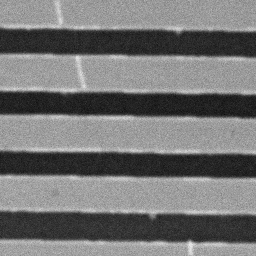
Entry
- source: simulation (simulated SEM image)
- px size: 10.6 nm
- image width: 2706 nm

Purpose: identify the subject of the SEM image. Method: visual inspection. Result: lines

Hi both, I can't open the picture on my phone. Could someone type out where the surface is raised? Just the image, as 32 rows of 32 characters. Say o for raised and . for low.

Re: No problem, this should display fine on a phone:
oooooooooooooooooooooooooooooooo
oooooooooooooooooooooooooooooooo
oooooooooooooooooooooooooooooooo
........oooooooooooooooooooooooo
................................
................................
................................
oooooooooooooooooooooooooooooooo
oooooooooooooooooooooooooooooooo
oooooooooooooooooooooooooooooooo
oooooooooooooooooooooooooooooooo
......................oooooooooo
................................
................................
oooooooooo......................
oooooooooooooooooooooooooooooooo
oooooooooooooooooooooooooooooooo
oooooooooooooooooooooooooooooooo
oooooooooooooooooooooooooooooooo
................................
................................
................................
oooooooooooooooooooooooooooooooo
oooooooooooooooooooooooooooooooo
oooooooooooooooooooooooooooooooo
oooooooooooooooooooooooooooooooo
..............oooooooooooooooooo
................................
................................
................................
ooooooooooooooooooooooooooooo...
oooooooooooooooooooooooooooooooo